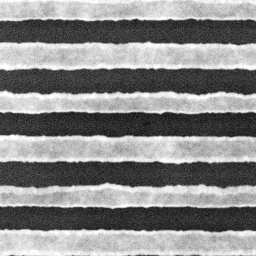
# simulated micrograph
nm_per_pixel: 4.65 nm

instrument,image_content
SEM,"lines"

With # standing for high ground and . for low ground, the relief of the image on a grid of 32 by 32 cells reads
################################
################################
###.......###.#.................
................................
................................
.#.###....###....##.............
################################
################################
####.#######.#.......##..####.##
................................
................................
................................
################################
################################
................................
................................
................................
################################
################################
################################
................................
................................
................................
.......#.#######.........#......
################################
################################
................................
................................
................................
################################
################################
################################